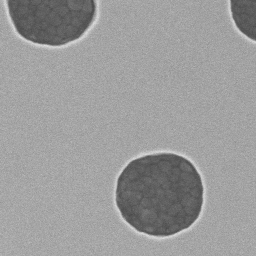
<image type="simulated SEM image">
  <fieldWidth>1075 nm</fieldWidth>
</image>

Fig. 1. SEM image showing holes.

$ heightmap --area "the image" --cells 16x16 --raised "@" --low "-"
@-----@@@@@@@@--
@-----@@@@@@@@@-
@@---@@@@@@@@@@@
@@@@@@@@@@@@@@@@
@@@@@@@@@@@@@@@@
@@@@@@@@@@@@@@@@
@@@@@@@@@@@@@@@@
@@@@@@@@@@@@@@@@
@@@@@@@@@@@@@@@@
@@@@@@@@@@@@@@@@
@@@@@@@@----@@@@
@@@@@@@------@@@
@@@@@@@------@@@
@@@@@@@@----@@@@
@@@@@@@@@--@@@@@
@@@@@@@@@@@@@@@@